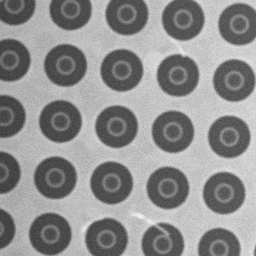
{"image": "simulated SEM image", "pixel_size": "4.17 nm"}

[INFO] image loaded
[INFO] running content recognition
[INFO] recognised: an array of small figures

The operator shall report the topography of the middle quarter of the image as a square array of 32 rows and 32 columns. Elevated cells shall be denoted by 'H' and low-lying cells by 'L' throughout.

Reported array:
HHLLLLHHHLLLHHHHLLLLHHHHLLLLLLLL
HHLLLLHHHLLLHHHHHLLLHHHLLLLHHHLL
LLLLLHHHHLLLHHHHLLLLHHHLLLLHHHHL
LLLLLHHHHLLLLHHHLLLLHHHLLLLHHHLL
LLLLHHHHHHLLLLLLLLLHHHHLLLLHHHLL
LLHHHHHHHHHLLLLLLLHHHHHHLLLLLLLL
HHHHHHHHHHHHLLLLLHHHHHHHLLLLLLLL
HHHHHHHHHHHHHHHHHHHHHHHHHHLLLLLH
HHHHHHHHHHHHHHHHHHHHHHHHHHHHHHHH
LLHHHHHHHHHHHHHHHHHHHHHHHHHHHHHH
LLLHHHHHHHHLLLLHHHHHHHHHHHHLHHHH
LLLLHHHHHLLLLLLLLHHHHHHHHHHLHHHH
LLLLHHHHHLLLLLLLLLHHHHHHLLLLLLHH
HLLLLHHHLLLLLLLLLLHHHHHLLLLLLLLH
HLLLLHHHLLLHHHHLLLLHHHLLLLLLLLLL
HLLLLHHLLLLHHHHLLLLHHHLLLLHHHLLL
LLLLHHHHLLLHHHHLLLLHHHLLLHHHHLLL
LLLLHHHHLLLLHHLLLLHHHHLLLHHHHLLL
LLLHHHHHLLLLLLLLLLHHHHLLLLHHHLLL
LHHHHHHHHLLLLLLLLHHHHHLLLLLLLLLL
HHHHHHHHHHLLLLLLHHHHHHHLLLLLLLLH
HHHHHHHHHHHHHHHHHHHHHHHHLLLLLLHH
HHHHHHHHHHHHHHHHHHHHHHHHHHHHHHHH
HHHHHHHHHHHHHHHHHHHHHHHHHHHHHHHH
LLHHHHHHHHLLLLHHHHHHHHHHHHHHHHHH
LLLHHHHHLLLLLLLHHHHHHHHHHLHHHHHH
LLLHHHHLLLLLLLLLHHHHHHHLLLLLLHHH
LLLHHHHLLLLLLLLLLHHHHHLLLLLLLLHH
LLLHHHLLLLHHHHLLLHHHHLLLLLLLLLLH
LLLHHHLLLLHHHHLLLHHHHLLLHHHHLLLH
LLLHHHLLLLHHHHLLLHHHLLLLHHHHLLLH
LLHHHHHLLLLHHLLLLHHHLLLLHHHHLLLH